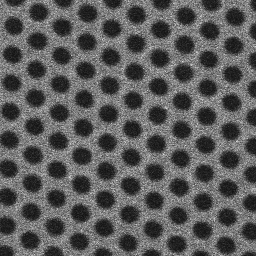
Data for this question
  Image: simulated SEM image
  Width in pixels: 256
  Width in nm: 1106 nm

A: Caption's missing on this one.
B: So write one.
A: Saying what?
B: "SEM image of a regular array of holes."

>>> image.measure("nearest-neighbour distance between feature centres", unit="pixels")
28.1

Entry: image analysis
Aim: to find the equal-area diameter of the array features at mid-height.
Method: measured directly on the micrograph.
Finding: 83.2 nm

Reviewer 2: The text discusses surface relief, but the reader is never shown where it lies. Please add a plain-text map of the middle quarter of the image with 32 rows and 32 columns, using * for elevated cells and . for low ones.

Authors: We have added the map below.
***....****..***...****..***...*
***.....*******.....********....
***.....*******.....*******.....
.***...***...***....***.****....
.********.....*******.....***..*
..*******.....*******.....******
.***.****.....*******.....******
***....***...***...***...***...*
***....********.....*******.....
***....********.....*******.....
****...***..***....****.***.....
.********....********....****..*
.********.....*******.....******
.********....********.....******
***....***...**...****...***...*
**.....********....********....*
**.....********.....*******.....
***....***.****....********.....
.********....***..***....***...*
.*******.....********.....******
.********....********.....******
***...****...**...***....***..**
**.....*******.....********....*
**.....*******.....********.....
***....***.****....********....*
********.....***..***...****...*
.*******.....*******.....*******
.*******.....*******.....*******
**....***...***...***....***.***
**.....*******.....********....*
**.....*******.....*******.....*
**.....*******.....*******.....*